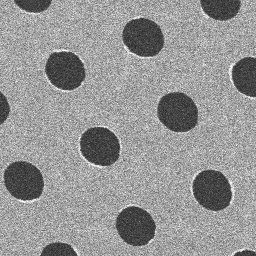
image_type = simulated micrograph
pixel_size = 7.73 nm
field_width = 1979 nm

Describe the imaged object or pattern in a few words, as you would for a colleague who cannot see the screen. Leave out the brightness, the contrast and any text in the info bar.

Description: holes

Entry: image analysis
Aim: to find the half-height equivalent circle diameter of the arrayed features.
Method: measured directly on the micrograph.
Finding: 310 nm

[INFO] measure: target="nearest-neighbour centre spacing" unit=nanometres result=646